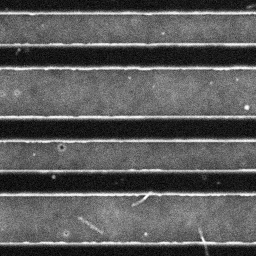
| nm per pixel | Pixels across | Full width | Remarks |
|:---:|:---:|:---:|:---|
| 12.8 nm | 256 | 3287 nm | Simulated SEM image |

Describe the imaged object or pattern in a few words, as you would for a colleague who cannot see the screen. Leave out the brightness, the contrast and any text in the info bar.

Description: lines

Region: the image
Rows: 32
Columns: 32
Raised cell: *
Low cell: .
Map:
********************************
********************************
................................
................................
................................
................................
********************************
********************************
********************************
................................
................................
................................
................................
................................
................................
********************************
********************************
********************************
................................
................................
................................
********************************
********************************
********************************
................................
................................
................................
................................
................................
................................
********************************
********************************